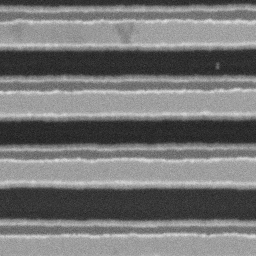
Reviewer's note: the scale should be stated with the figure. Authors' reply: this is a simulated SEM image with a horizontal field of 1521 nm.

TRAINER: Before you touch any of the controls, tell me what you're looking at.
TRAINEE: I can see lines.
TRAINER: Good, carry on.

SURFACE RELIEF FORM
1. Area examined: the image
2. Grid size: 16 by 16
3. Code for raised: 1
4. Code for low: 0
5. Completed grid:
0000000000000000
1111111111111111
1111111111111111
0000000000000000
0000000000000000
1111111111111111
1111111111111111
0000000000000000
0000000000000000
1111111111111111
1111111111111111
1001111111111111
0000000000000000
0000000000000000
1111111111111111
1111111111111111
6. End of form